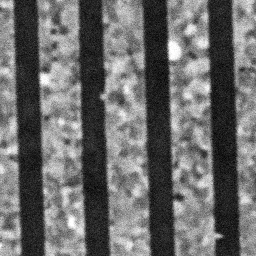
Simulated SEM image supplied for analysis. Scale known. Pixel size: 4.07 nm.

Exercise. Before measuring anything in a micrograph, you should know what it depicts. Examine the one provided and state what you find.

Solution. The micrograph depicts one or a few lines or trenches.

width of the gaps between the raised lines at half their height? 26.5 px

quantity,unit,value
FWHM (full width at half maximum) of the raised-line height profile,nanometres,155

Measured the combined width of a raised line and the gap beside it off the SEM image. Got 264 nanometers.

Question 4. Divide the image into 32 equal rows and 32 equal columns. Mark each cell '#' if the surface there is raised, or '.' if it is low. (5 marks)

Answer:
#....#####...#####...#####...###
##...#####...#####...#####...###
##...#####...#####...#####...###
##...#####...#####...#####...###
##...#####...#####...#####...###
##...#####...#####...#####...###
##...#####...#####...#####...###
##...#####...#####...#####...###
##...#####...#####...#####...###
##...#####...#####...#####...###
##...#####...#####...#####...###
##...#####...#####...#####...###
##...#####...#####....####....##
##...#####...#####...#####....##
##...#####...#####...#####....##
##...#####...#####....####....##
##...#####...#####....####....##
##...#####...#####....####....##
##...#####...#####....####....##
##...#####...#####....####....##
##...#####...####.....####....##
##...#####....####....####....##
##...#####....####....####....##
##....####....####....#####...##
##....####....####....#####...##
##....####....#####...#####...##
##....####....####....#####...##
##....####....####....#####...##
##....####....###.....#####...##
##....####....#####...#####...##
##....####....#####...#####...##
##....#####...#####...#####...##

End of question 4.